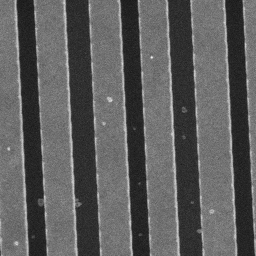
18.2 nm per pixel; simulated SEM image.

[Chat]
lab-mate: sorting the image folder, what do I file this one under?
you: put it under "lines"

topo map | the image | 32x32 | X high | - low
XX--XXXX---XXXX--XXXX---XXXX--XX
XX--XXXX---XXXX--XXXX---XXXX--XX
XX--XXXX---XXXX--XXXX---XXXX--XX
XX--XXXX---XXXX--XXXX---XXXX---X
XX--XXXX---XXXX---XXX---XXXX---X
XX---XXX---XXXX---XXX---XXXX---X
XX---XXX---XXXX---XXX---XXXX---X
XX---XXX---XXXX---XXX---XXXXX--X
XX---XXXX--XXXX---XXX---XXXXX--X
XX---XXXX---XXX---XXX---XXXXX--X
XXX--XXXX---XXX---XXX---XXXXX--X
XXX--XXXX---XXXX--XXX---XXXXX--X
XXX--XXXX---XXXX--XXX---XXXXX--X
XXX--XXXX---XXXX--XXXX---XXXX--X
XXX--XXXX---XXXX--XXXX---XXXX--X
XXX--XXXX---XXXX--XXXX---XXXX--X
XXX--XXXX---XXXX--XXXX---XXXX--X
XXX--XXXX---XXXX--XXXX---XXXX--X
XXX--XXXX---XXXX--XXXX---XXXX--X
XXX--XXXX---XXXX--XXXX---XXXX--X
XXX--XXXX---XXXX--XXXX---XXXX--X
XXX--XXXX---XXXX--XXXX---XXXX--X
XXX--XXXX---XXXX--XXXX---XXXX--X
XXX--XXXX---XXXX--XXXX---XXXX---
XXX---XXX---XXXX--XXXX---XXXX---
XXX---XXX---XXXX--XXXX---XXXX---
XXX---XXX---XXXX---XXX---XXXX---
XXX---XXX---XXXX---XXX---XXXX---
XXX---XXX---XXXX---XXX---XXXX---
XXXX--XXXX--XXXX---XXX---XXXX---
XXXX--XXXX---XXX---XXX---XXXXX--
XXXX--XXXX---XXXX--XXX---XXXXX--